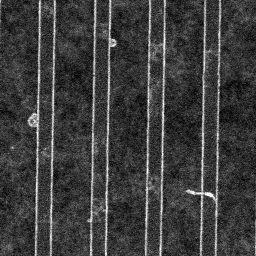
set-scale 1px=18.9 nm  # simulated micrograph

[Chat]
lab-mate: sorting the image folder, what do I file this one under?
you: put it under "parallel lines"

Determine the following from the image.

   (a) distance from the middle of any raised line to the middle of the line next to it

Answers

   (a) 1040 nanometers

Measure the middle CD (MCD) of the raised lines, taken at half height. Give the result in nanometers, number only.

288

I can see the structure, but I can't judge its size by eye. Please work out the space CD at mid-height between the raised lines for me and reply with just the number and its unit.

752 nm